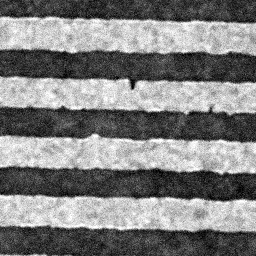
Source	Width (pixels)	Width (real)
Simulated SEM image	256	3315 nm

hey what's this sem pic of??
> parallel lines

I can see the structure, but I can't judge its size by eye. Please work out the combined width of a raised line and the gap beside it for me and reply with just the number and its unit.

766 nm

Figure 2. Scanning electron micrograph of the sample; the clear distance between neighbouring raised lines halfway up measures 384 nm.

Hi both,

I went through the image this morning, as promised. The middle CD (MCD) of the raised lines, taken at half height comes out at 383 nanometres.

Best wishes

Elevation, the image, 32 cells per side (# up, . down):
................................
................................
###########.#.#.................
################################
################################
################################
.................#####.#..##..##
................................
................................
................................
################.###############
################################
################################
.........####.##################
................................
................................
................................
################....#...........
################################
################################
################################
...........................#####
................................
................................
..#.............................
################################
################################
################################
...............#.##.############
................................
................................
................................